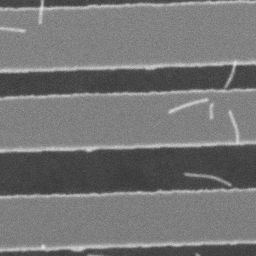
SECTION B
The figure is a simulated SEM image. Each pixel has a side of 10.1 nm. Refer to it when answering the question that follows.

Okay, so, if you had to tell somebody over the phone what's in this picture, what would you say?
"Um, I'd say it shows lines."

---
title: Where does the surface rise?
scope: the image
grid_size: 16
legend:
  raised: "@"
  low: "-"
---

--@@@@@@@@@@@@@@
@@@@@@@@@@@@@@@@
@@@@@@@@@@@@@@@@
@@@@@@@@@@@@@@@@
@---------------
----------------
@@@@@@@@@@@@@@@@
@@@@@@@@@@@@@@@@
@@@@@@@@@@@@@@@@
----------------
----------------
----------------
@@@@@@@@@@@@@@@@
@@@@@@@@@@@@@@@@
@@@@@@@@@@@@@@@@
@@@@@-----------